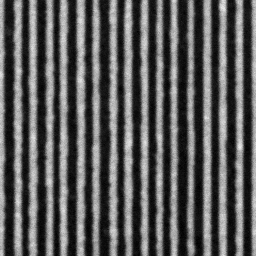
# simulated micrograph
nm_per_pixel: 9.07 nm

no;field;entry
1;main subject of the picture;parallel lines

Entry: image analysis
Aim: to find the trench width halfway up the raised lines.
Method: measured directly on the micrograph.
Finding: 94.1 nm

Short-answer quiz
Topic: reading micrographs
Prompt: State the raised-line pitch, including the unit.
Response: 144 nanometers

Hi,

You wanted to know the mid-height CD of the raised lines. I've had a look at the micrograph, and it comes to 0.0544 µm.